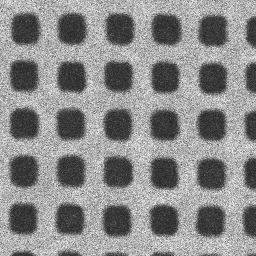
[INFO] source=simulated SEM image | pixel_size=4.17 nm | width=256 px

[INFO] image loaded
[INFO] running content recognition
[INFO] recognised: a regular array of holes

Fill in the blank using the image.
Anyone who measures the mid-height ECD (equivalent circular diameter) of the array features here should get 128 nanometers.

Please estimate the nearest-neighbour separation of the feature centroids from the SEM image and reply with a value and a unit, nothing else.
0.195 µm